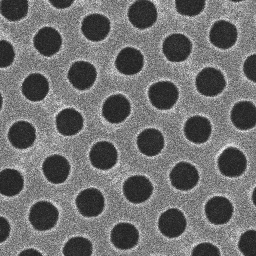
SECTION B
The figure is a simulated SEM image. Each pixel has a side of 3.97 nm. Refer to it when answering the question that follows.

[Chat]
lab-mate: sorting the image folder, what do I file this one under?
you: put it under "a regular array of holes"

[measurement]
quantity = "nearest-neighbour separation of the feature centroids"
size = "190 nm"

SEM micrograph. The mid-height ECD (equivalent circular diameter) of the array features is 111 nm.